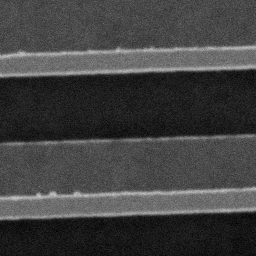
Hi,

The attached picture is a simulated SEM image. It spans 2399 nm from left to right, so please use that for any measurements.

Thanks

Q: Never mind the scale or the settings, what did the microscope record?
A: lines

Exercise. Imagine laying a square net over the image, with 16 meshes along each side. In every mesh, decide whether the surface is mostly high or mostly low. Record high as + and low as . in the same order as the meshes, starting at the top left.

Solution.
++++++++++++++++
++++++++++++++++
++++++++++++++++
++++++++++++++++
+++++++++.......
................
................
................
...............+
++++++++++++++++
++++++++++++++++
++++++++++++++++
++++++++++++++++
++++++..........
................
................